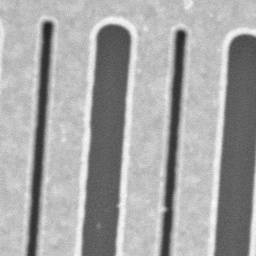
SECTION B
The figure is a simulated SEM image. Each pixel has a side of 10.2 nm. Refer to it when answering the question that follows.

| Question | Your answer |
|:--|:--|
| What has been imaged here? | one or a few lines or trenches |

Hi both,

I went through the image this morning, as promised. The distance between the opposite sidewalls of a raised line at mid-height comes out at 0.392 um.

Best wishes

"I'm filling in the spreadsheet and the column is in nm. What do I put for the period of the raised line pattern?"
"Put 677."